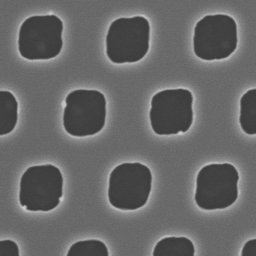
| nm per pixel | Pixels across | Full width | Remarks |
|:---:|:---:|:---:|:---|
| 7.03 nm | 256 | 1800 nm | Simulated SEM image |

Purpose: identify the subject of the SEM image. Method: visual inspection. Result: a regular array of holes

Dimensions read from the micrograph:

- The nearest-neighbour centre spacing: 0.603 um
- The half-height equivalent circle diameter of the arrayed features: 327 nm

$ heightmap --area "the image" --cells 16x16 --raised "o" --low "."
oooooooooooooooo
o...ooo..ooo...o
o...ooo..ooo...o
oo.oooo..ooo..oo
oooooooooooooooo
oooooooooooooooo
.ooo...oo...ooo.
.ooo...oo...ooo.
oooooooooooooooo
oooooooooooooooo
oo.oooo..oooo..o
o...ooo..ooo...o
o...ooo..ooo...o
oooooooooooooooo
oooooooooooooooo
.ooo...ooo..ooo.